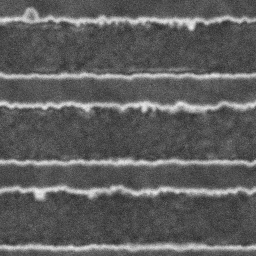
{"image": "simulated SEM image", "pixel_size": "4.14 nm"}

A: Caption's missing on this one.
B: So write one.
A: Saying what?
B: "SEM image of lines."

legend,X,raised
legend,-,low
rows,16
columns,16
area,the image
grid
XXXXXXXXXXXXXXXX
----------------
----------------
----------------
----------------
XXXXXXXXXXXXXXXX
XXXXXXXXXXXXXXXX
----------------
----------------
----------------
XXXXXXXXXXXXXXXX
XXXXXXXXXXXXXXXX
----------------
----------------
----------------
XXXXXXXXXXXXXXXX